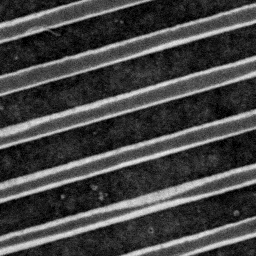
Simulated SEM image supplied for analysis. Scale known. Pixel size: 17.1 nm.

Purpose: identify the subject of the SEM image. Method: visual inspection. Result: lines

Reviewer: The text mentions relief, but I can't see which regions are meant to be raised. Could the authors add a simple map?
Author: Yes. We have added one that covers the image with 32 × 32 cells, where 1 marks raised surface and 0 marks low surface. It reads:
00000000011111111000000000000000
00000011111110000000000000000111
00111111110000000000000001111111
11111100000000000000001111111000
11100000000000000011111111000000
00000000000000011111110000000000
00000000000111111100000000000000
00000000111111100000000000000001
00001111111100000000000000011111
11111111000000000000000011111110
11111000000000000000111111110000
10000000000000000111111110000000
00000000000000111111100000000000
00000000001111111100000000000000
00000001111111000000000000000011
00001111111000000000000000111111
11111110000000000000000111111100
11110000000000000001111111100000
00000000000000001111111000000000
00000000000011111111000000000000
00000000011111110000000000000000
00000011111110000000000000000111
00111111100000000000000000111111
11111100000000000000000111111000
11000000000000000000111111000000
00000000000000001111110000000000
00000000000011111100000000000000
00000000111111100000000000000001
00001111111000000000000000001111
01111111000000000000000001111110
11110000000000000000011111110000
00000000000000000111111110000000